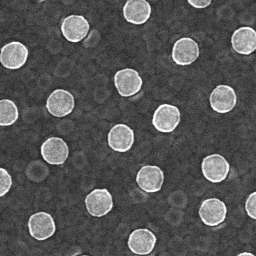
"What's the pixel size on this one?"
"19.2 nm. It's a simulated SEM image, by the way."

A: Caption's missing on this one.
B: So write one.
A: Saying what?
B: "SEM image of a regular array of raised bodies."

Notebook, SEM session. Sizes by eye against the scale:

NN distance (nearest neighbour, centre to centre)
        962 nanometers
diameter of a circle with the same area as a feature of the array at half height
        505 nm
